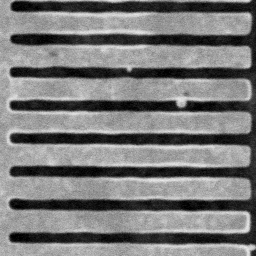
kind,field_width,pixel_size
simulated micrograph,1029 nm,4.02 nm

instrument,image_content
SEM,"groups of lines, slits or small figures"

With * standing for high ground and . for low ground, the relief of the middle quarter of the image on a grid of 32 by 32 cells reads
********************************
................................
................................
...............*................
********************************
********************************
********************************
********************************
********************************
.............................*..
................................
................................
***************************.****
********************************
********************************
********************************
********************************
................................
................................
................................
*************...*...............
********************************
********************************
********************************
********************************
................................
................................
................................
**..............................
********************************
********************************
********************************